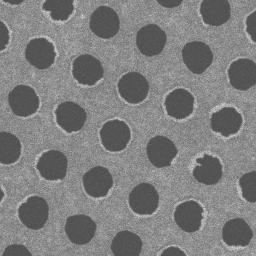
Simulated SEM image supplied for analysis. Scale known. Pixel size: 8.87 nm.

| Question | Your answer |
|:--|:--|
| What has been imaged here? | a regular array of holes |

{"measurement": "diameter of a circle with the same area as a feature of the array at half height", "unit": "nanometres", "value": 275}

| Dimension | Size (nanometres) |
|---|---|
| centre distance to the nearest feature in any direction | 435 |